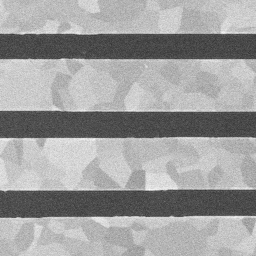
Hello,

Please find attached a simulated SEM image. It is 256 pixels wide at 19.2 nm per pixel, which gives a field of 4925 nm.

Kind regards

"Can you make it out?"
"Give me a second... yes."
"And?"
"lines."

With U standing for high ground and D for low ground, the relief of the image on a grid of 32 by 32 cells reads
UUUUUUUUUUUUUUUUUUUUUUUUUUUUUUUU
UUUUUUUUUUUUUUUUUUUUUUUUUUUUUUUU
UUUUUUUUUUUUUUUUUUUUUUUUUUUUUUUU
UUUUUUUUUUUUUUUUUUUUUUUUUUUUUUUU
DDDDDDDDDDDDDDDDDDDDDDDDDDDDDDDD
DDDDDDDDDDDDDDDDDDDDDDDDDDDDDDDD
DDDDDDDDDDDDDDDDDDDDDDDDDDDDDDDD
UUUUUUUUUUUUUUUUUUUUUUUUUUUUUUUU
UUUUUUUUUUUUUUUUUUUUUUUUUUUUUUUU
UUUUUUUUUUUUUUUUUUUUUUUUUUUUUUUU
UUUUUUUUUUUUUUUUUUUUUUUUUUUUUUUU
UUUUUUUUUUUUUUUUUUUUUUUUUUUUUUUU
UUUUUUUUUUUUUUUUUUUUUUUUUUUUUUUU
UUUUUUUUUUUUUUUUUUUUUUUUUUUUUUUU
DDDDDDDDDDDDDDDDDDDDDDDDDDDDDDDD
DDDDDDDDDDDDDDDDDDDDDDDDDDDDDDDD
DDDDDDDDDDDDDDDDDDDDDDDDDDDDDDDD
UUUUUUUUUUUUUUUUUUUUUUUUUUUUUUUU
UUUUUUUUUUUUUUUUUUUUUUUUUUUUUUUU
UUUUUUUUUUUUUUUUUUUUUUUUUUUUUUUU
UUUUUUUUUUUUUUUUUUUUUUUUUUUUUUUU
UUUUUUUUUUUUUUUUUUUUUUUUUUUUUUUU
UUUUUUUUUUUUUUUUUUUUUUUUUUUUUUUU
UUUUUUUUUUUUUUUUUUUUUUUUUUUUUUUU
DDDDDDDDDDDDDDDDDDDDDDDDDDDDDDDD
DDDDDDDDDDDDDDDDDDDDDDDDDDDDDDDD
DDDDDDDDDDDDDDDDDDDDDDDDDDDDDDDD
UUUUUUUUUUUUUUUUUUUUUUUUUUUUUUUU
UUUUUUUUUUUUUUUUUUUUUUUUUUUUUUUU
UUUUUUUUUUUUUUUUUUUUUUUUUUUUUUUU
UUUUUUUUUUUUUUUUUUUUUUUUUUUUUUUU
UUUUUUUUUUUUUUUUUUUUUUUUUUUUUUUU